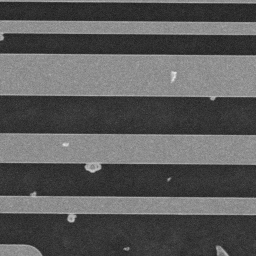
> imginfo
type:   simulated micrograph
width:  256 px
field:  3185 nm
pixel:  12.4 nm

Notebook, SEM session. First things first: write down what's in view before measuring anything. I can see groups of lines, slits or small figures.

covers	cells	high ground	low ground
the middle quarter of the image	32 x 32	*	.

********************************
********************************
********************************
********************************
********************************
********************************
********************************
********************************
................................
................................
................................
................................
................................
................................
................................
................................
................................
*...............................
********************************
********************************
********************************
********************************
********************************
********************************
********************************
................................
................................
................................
................................
................................
................................
................................